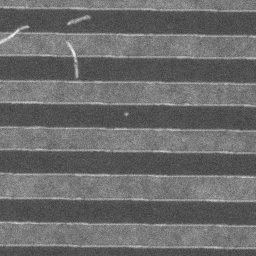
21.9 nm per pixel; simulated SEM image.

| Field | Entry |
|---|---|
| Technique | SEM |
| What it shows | lines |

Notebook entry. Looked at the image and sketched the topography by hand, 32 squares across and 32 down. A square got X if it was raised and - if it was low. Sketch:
--------------------------------
XXXXXXXXXXXXXXXXXXXXXXXXXXXXXXXX
XXXXXXXXXXXXXXXXXXXXXXXXXXXXXXXX
XXXXXXXXXXXXXXXXXXXXXXXXXXXXXXXX
-------------------------------X
--------------------------------
--------------------------------
XXXXXXXXXXXXXXXXXXXXXXXXXXXXXXXX
XXXXXXXXXXXXXXXXXXXXXXXXXXXXXXXX
XXXXXXXXXXXXXXXXXXXXXXXXXXXXXXXX
--------------------------------
--------------------------------
--------------------------------
XXXXXXXXXXXXXXXXXXXXXXXXXXXXXXXX
XXXXXXXXXXXXXXXXXXXXXXXXXXXXXXXX
XXXXXXXXXXXXXXXXXXXXXXXXXXXXXXXX
--------------------------------
--------------------------------
--------------------------------
XXXXXXXXXXXXXXXXXXXXXXXXXXXXXXXX
XXXXXXXXXXXXXXXXXXXXXXXXXXXXXXXX
XXXXXXXXXXXXXXXXXXXXXXXXXXXXXXXX
--------------------------------
--------------------------------
--------------------------------
XXXXXXXXXXXXXXXXXXXXXXXXXXXXXXXX
XXXXXXXXXXXXXXXXXXXXXXXXXXXXXXXX
XXXXXXXXXXXXXXXXXXXXXXXXXXXXXXXX
--------------------------------
--------------------------------
--------------------------------
XXXXXXXXXXXXXXXXXXXXXXXXXXXXXXXX